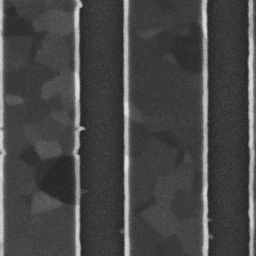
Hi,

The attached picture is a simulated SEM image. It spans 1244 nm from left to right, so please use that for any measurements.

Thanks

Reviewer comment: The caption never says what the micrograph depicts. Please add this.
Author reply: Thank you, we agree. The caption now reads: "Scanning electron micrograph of one or a few lines or trenches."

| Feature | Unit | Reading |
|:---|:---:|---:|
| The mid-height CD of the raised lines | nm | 386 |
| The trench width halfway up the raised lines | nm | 223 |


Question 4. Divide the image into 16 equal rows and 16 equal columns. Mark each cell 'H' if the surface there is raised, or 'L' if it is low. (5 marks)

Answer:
HHHHHLLLHHHHHLLL
HHHHHLLLHHHHHLLL
HHHHHLLLHHHHHLLL
HHHHHLLLHHHHHLLL
HHHHHLLLHHHHHLLL
HHHHHLLLHHHHHLLL
HHHHHLLLHHHHHLLL
HHHHHLLLHHHHHLLL
HHHHHLLLHHHHHLLL
HHHHHLLLHHHHHLLL
HHHHHLLLHHHHHLLL
HHHHHLLLHHHHHLLL
HHHHHLLLHHHHHLLL
HHHHHLLLHHHHHLLL
HHHHHLLLHHHHHLLL
HHHHHLLLHHHHHLLL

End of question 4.